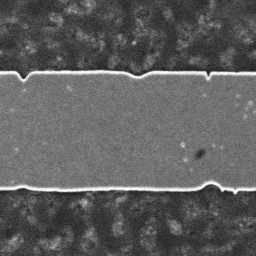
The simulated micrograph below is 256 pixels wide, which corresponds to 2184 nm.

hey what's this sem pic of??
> one or a few lines or trenches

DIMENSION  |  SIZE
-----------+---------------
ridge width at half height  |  1000 nm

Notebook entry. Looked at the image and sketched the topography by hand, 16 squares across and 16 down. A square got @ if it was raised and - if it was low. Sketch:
----------------
----------------
----------------
----------------
------@---------
@@@@@@@@@@@@@@@@
@@@@@@@@@@@@@@@@
@@@@@@@@@@@@@@@@
@@@@@@@@@@@@@@@@
@@@@@@@@@@@@@@@@
@@@@@@@@@@@@@@@@
@@@@@@@@@@@@@@@@
----------------
----------------
----------------
----------------